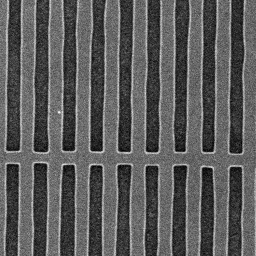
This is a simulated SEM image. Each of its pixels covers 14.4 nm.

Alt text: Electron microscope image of groups of lines, slits or small figures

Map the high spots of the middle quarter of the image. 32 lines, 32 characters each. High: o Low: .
...oooo...oooo...oooo...oooo...o
...oooo...oooo...oooo...oooo...o
...oooo...oooo...oooo...oooo...o
...oooo...oooo...oooo...oooo...o
...oooo...oooo...ooo....oooo...o
...oooo...oooo...ooo....oooo...o
...oooo...oooo...ooo....oooo...o
...oooo...oooo...ooo....oooo...o
...ooo....oooo...ooo....oooo...o
...ooo....oooo...ooo....oooo...o
...ooo....oooo...ooo....oooo...o
...ooo....oooo...ooo....oooo...o
...ooo....oooo...ooo....ooo....o
...ooo....oooo...ooo....ooo....o
...ooo....oooo...ooo....ooo....o
...ooo....ooo....ooo....ooo....o
...ooo....ooo....ooo....ooo....o
...ooo....ooo....ooo....ooo....o
...ooo....ooo....ooo....ooo....o
...ooo....ooo....ooo....oooo...o
...ooo....ooo....ooo....oooo...o
...oooo...ooo....ooo....oooo...o
oooooooooooooooooooooooooooooooo
oooooooooooooooooooooooooooooooo
oooooooooooooooooooooooooooooooo
...oooo...ooo....oooo..ooooo...o
...ooo....ooo....ooo....ooo....o
...ooo....ooo....ooo....ooo....o
...ooo....ooo....ooo....ooo....o
...ooo....ooo....ooo....ooo....o
...ooo....ooo....ooo....ooo....o
...ooo....ooo....ooo....ooo....o